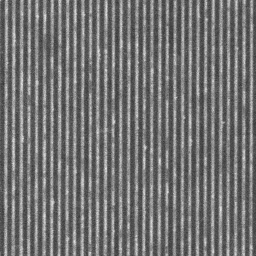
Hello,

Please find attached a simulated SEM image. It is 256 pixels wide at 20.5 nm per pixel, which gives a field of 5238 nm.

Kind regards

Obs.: parallel lines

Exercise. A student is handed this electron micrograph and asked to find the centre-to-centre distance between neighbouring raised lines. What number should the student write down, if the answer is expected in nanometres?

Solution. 157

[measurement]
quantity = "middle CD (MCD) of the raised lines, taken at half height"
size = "56.3 nm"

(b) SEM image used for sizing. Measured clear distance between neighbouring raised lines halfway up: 112 nm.